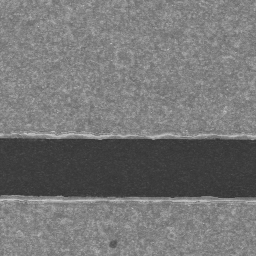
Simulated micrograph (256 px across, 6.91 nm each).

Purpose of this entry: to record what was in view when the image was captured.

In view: one or a few lines or trenches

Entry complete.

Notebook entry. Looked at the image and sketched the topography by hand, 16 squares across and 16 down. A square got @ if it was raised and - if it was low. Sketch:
@@@@@@@@@@@@@@@@
@@@@@@@@@@@@@@@@
@@@@@@@@@@@@@@@@
@@@@@@@@@@@@@@@@
@@@@@@@@@@@@@@@@
@@@@@@@@@@@@@@@@
@@@@@@@@@@@@@@@@
@@@@@@@@@@@@@@@@
---------@-@--@-
----------------
----------------
----------------
----------------
@@@@@@@@@@@@@@@@
@@@@@@@@@@@@@@@@
@@@@@@@@@@@@@@@@